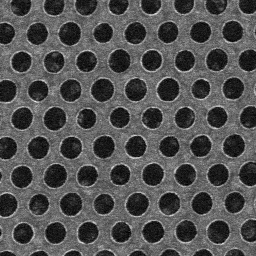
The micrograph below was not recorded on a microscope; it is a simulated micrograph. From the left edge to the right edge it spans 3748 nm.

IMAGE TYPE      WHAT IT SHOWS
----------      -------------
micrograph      a regular array of holes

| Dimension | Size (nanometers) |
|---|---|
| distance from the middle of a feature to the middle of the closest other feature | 470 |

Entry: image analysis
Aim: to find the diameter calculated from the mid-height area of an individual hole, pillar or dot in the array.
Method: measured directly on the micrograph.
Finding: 328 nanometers